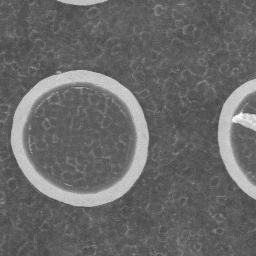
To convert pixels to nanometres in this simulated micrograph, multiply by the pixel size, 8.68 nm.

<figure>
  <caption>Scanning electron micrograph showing raised bodies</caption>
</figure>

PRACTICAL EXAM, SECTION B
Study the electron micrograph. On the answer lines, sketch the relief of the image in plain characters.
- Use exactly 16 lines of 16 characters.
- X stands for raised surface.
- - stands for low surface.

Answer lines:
----------------
----------------
----------------
----------------
----------------
---XXXX---------
--XXXXXX-------X
-XXXXXXXX-----XX
-XXXXXXXX-----XX
-XXXXXXXX-----XX
--XXXXXXX------X
---XXXXX-------X
----------------
----------------
----------------
----------------